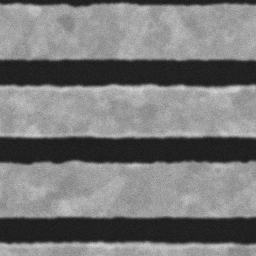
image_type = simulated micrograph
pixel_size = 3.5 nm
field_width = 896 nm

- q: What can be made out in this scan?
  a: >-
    lines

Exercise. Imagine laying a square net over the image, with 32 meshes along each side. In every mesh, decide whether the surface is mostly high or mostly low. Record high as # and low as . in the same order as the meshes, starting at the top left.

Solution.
...............#................
################################
################################
################################
################################
################################
################################
................................
................................
................................
................................
################################
################################
################################
################################
################################
################################
................................
................................
................................
##..###.####.##.#..#############
################################
################################
################################
################################
################################
################################
................................
................................
................................
#.###################..##...#...
################################